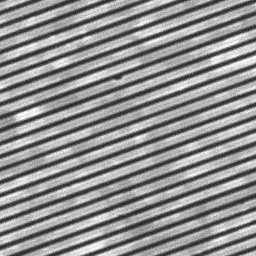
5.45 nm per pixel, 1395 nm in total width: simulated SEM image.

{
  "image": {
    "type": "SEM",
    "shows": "parallel lines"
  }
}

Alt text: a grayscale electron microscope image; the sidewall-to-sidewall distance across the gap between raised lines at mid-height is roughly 33.3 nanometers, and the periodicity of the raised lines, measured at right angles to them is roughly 66.9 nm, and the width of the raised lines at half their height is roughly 33.3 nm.